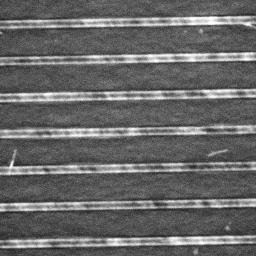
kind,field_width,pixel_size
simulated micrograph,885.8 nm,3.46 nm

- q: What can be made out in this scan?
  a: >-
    parallel lines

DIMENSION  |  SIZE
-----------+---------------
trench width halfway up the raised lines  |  29.1 pixels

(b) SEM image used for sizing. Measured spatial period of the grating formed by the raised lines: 126 nanometers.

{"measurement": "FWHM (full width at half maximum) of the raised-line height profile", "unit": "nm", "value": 25.1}